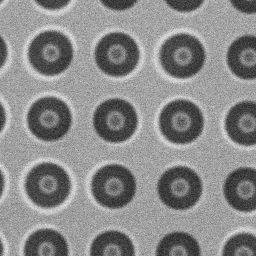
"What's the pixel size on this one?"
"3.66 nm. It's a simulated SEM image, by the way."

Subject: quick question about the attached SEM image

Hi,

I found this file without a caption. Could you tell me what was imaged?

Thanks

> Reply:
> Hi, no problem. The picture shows an array of small figures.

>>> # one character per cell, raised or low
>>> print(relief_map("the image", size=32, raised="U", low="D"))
UUUUDDDDDUUUUDDDDUUUUDDDDUUUUDDD
UUUUUUDUUUUUUUUUUUUUUUDDUUUUUUDD
UUUUUUUUUUUUUUUUUUUUUUUUUUUUUUUU
UUUUUUUUUUUUUUUUUUUUUUUUUUUUUUUU
UUUUDDDDDUUUUDDDUUUUUDDDDUUUUUDD
DUUUDDDDDUUUDDDDDUUUDDDDDUUUUDDD
DUUDDDDDDUUUDDDDDDUUDDDDDDUUDDDD
DUUDDDDDDUUUDDDDDDUUDDDDDDUUDDDD
DUUUDDDDUUUUDDDDDUUUDDDDDUUUUDDD
UUUUUDDUUUUUUDDDUUUUUDDDUUUUUDDD
UUUUUUUUUUUUUUUUUUUUUUUUUUUUUUUU
UUUUUUUUUUUUUUUUUUUUUUUUUUUUUUUU
UUUUDDDDUUUUUDDDUUUUUDDDUUUUUUUU
DUUUDDDDDUUUDDDDDUUUDDDDDUUUUDDD
DUUDDDDDDUUUDDDDDUUUDDDDDUUUDDDD
DUUDDDDDDUUUDDDDDUUUDDDDDDUUDDDD
UUUUDDDDDUUUDDDDDUUUDDDDDUUUDDDD
UUUUUDDUUUUUUDDDUUUUUDDDUUUUUDDD
UUUUUUUUUUUUUUUUUUUUUUUUUUUUUUUU
UUUUUUUUUUUUUUUUUUUUUUUUUUUUUUUU
UUUUDDDUUUUUUDDUUUUUUUDUUUUUUUUU
UUUDDDDDDUUUDDDDUUUUDDDDDUUUUDDD
DUUDDDDDDUUDDDDDDUUUDDDDDUUUDDDD
DUUDDDDDDUUDDDDDDUUUDDDDDUUUDDDD
UUUDDDDDDUUDDDDDDUUUDDDDDUUUDDDD
UUUUDDDDUUUUDDDDUUUUDDDDDUUUDDDD
UUUUUUUUUUUUUUUUUUUUUUUUUUUUUUDD
UUUUUUUUUUUUUUUUUUUUUUUUUUUUUUUU
UUUUUDUUUUUUUUUUUUUUUUUUUUUUUUUU
UUUDDDDDUUUUDDDDUUUUUDDDUUUUUDDD
DUUDDDDDDUUDDDDDDUUUDDDDDUUUDDDD
DUUDDDDDDUUDDDDDDUUDDDDDDUUUDDDD